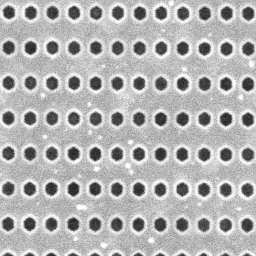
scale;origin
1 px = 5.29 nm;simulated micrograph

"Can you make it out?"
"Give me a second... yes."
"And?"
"a regular array of holes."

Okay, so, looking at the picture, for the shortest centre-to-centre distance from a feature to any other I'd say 114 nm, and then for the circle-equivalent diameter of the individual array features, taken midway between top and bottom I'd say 73.8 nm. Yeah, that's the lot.